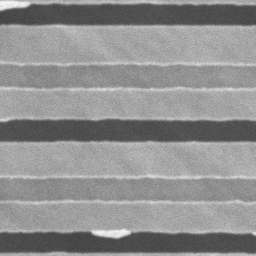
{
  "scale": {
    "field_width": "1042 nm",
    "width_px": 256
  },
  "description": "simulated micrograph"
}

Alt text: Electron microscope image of lines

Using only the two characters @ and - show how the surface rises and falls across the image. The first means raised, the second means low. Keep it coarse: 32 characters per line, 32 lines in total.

@@@@----@-------------@-@-@--@@@
--------------------------------
--------------------------------
@@@@@@@@@@@@@@@@@@@@@@@@@@@@@@@@
@@@@@@@@@@@@@@@@@@@@@@@@@@@@@@@@
@@@@@@@@@@@@@@@@@@@@@@@@@@@@@@@@
@@@@@@@@@@@@@@@@@@@@@@@@@@@@@@@@
@@@@@@@@@@@@@@@@@@@@@@@@@@@@@@@@
@@@@@@@@@@@@@@@@@@@@@@@@@@@@@@@@
@@@@@@@@@@@@@@@@@@@@@@@@@@@@@@@@
@@@@@@@@@@@@@@@@@@@@@@@@@@@@@@@@
@@@@@@@@@@@@@@@@@@@@@@@@@@@@@@@@
@@@@@@@@@@@@@@@@@@@@@@@@@@@@@@@@
@@@@@@@@@@@@@@@@@@@@@@@@@@@@@@@@
@@@@@@@@@@@@@@@@@@@@@@@@@@@@@@@@
--------------------------------
--------------------------------
--------------------------------
@@@@@@@@@@@@@@@@@@@@@@@@@@@@@@@@
@@@@@@@@@@@@@@@@@@@@@@@@@@@@@@@@
@@@@@@@@@@@@@@@@@@@@@@@@@@@@@@@@
@@@@@@@@@@@@@@@@@@@@@@@@@@@@@@@@
@@@@@@@@@@@@@@@@@@@@@@@@@@@@@@@@
@@@@@@@@@@@@@@@@@@@@@@@@@@@@@@@@
@@@@@@@@@@@@@@@@@@@@@@@@@@@@@@@@
@@@@@@@@@@@@@@@@@@@@@@@@@@@@@@@@
@@@@@@@@@@@@@@@@@@@@@@@@@@@@@@@@
@@@@@@@@@@@@@@@@@@@@@@@@@@@@@@@@
@@@@@@@@@@@@@@@@@@@@@@@@@@@@@@@@
-------------@@-----------------
--------------------------------
--------------------------------